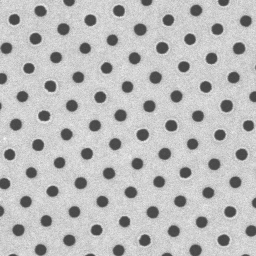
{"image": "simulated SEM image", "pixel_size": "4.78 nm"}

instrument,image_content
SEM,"a regular array of holes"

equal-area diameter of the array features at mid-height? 55 nm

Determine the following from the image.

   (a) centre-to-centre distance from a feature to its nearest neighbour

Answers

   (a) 135 nanometers